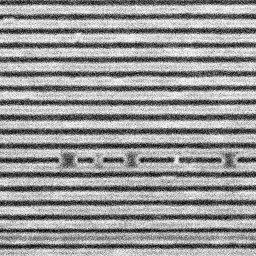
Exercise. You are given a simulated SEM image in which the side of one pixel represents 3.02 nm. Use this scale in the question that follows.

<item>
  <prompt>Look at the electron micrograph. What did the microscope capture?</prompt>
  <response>parallel lines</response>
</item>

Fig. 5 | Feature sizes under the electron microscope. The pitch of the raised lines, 0.0432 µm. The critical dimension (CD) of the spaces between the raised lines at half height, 18.9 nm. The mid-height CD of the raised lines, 0.0242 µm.